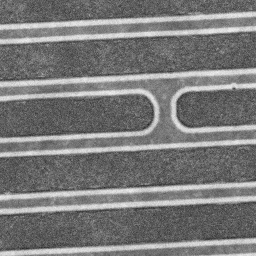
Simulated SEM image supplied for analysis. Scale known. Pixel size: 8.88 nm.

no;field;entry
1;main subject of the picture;parallel lines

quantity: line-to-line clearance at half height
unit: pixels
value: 42.1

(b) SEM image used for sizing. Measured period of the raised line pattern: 502 nanometers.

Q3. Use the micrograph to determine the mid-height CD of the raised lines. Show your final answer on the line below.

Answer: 135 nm